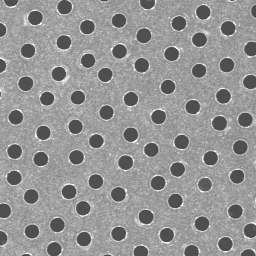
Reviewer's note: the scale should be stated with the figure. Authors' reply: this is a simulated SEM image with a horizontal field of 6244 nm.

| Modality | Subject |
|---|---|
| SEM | a regular array of holes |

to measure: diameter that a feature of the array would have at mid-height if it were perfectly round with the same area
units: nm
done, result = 359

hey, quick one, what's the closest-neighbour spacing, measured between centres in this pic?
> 661 nanometers